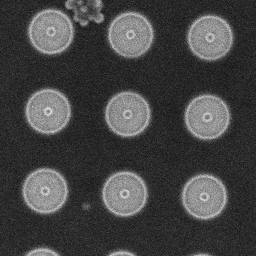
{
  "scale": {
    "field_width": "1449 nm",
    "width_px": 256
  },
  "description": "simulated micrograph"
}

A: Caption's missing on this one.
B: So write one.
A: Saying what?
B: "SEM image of an array of small figures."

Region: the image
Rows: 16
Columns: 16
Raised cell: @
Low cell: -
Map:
@@@@@@@@@@@@@@@@
@@--@@@--@@@--@@
@@--@@@--@@@--@@
@@@@@@@@@@@@@-@@
@@@@@@@@@@@@@@@@
@@@@@@@@@@@@@@@@
@@--@@@--@@@--@@
@@--@@@--@@@--@@
@@@@@@@@@@@@@@@@
@@@@@@@@@@@@@@@@
@@@@@@@@@@@@@@@@
@@--@@@--@@@--@@
@@--@@@--@@@--@@
@@@@@@@@@@@@@@@@
@@@@@@@@@@@@@@@@
@@@@@@@@@@@@@@@@